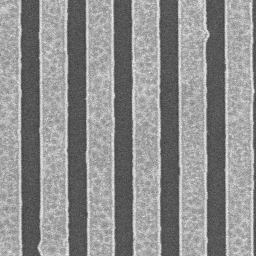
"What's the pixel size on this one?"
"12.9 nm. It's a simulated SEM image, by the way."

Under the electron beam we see parallel lines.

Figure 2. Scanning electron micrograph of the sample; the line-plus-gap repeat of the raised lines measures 599 nm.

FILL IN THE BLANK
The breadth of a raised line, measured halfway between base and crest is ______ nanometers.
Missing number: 324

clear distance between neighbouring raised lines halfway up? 266 nm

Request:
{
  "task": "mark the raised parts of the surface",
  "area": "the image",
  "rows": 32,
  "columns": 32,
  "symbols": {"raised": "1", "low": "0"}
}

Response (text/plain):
11000111000111000111000111001110
11000111000111000111001111001110
11000111000111000111001111001110
11100111000111000111001111001110
11000111000111000111001111001110
11000111000111000111000111001110
11000111000111000111001110001110
11000111000111000111001111001110
11000111000111000111001111001110
11000111000111000111000111001110
11000111000111000111001111001111
11000111000111000111000111001111
11000111000111000111000111001111
11000111000111000111001111001110
11000111000111000111000111001110
11000111000111000111001111001110
11000111000111000111000111001111
11000111000111000111000111001111
11000111000111000111000111001110
11000111000111000111000111001111
11000111000111000111000111001110
11000111000111000111000111001110
11000111000111000111000111001110
11100111000111000111000111001110
11100111000111000111000111001110
11100111000111000111000111001110
11100111000111000111000111001110
11100111000111000111000111001110
11100111000111000111000111001111
11100111000111000111000111001111
11100111000111000111000111001111
11100111000111000111000111000111